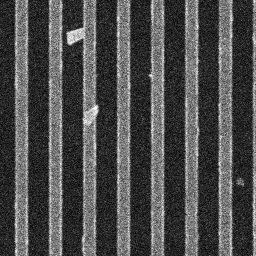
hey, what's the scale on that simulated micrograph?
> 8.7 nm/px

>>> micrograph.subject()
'parallel lines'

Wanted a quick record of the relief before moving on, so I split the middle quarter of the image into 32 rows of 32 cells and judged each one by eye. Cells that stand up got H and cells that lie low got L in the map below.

LLLLLHHHLLLLLHHHLLLLLLHHHLLLLLLH
LLLLLHHHLLLLLLHHLLLLLLHHHLLLLLLH
LLLLLHHHLLLLLHHHLLLLLLHHHLLLLLLH
LLLLLHHHLLLLLLHHLLLLLLHHHLLLLLLH
LLLLLHHHLLLLLLHHLLLLLLHHHLLLLLLH
LLLLLHHHLLLLLLHHLLLLLLHHHLLLLLLH
LLLLLHHHLLLLLLHHLLLLLLHHHLLLLLLH
LLLLLHHHLLLLLLHHLLLLLLHHHLLLLLLH
LLLLLHHHLLLLLLHHLLLLLLHHHLLLLLLH
LLLLLHHHLLLLLLHHLLLLLLHHHLLLLLLH
LLLLLHHHLLLLLLHHLLLLLLHHHLLLLLHH
LLLLLHHHLLLLLLHHLLLLLLHHHLLLLLLH
LLLLLHHHLLLLLLHHLLLLLLHHHLLLLLHH
LLLLLHHHLLLLLLHHLLLLLLHHHLLLLLLH
LLLLLHHHLLLLLLHHLLLLLLHHHLLLLLLH
LLLLLHHHLLLLLLHHLLLLLLHHHLLLLLLH
LLLLLHHHLLLLLLHHLLLLLLHHHLLLLLLH
LLLLLHHHLLLLLLHHLLLLLLHHHLLLLLHH
LLLLLHHHLLLLLLHHLLLLLLHHHLLLLLLH
LLLLLHHHLLLLLLHHLLLLLLHHHLLLLLHH
LLLLLHHHLLLLLLHHLLLLLLHHHLLLLLHH
LLLLLHHHLLLLLLHHLLLLLLHHHLLLLLLH
LLLLLHHHLLLLLLHHLLLLLLHHHLLLLLLH
LLLLLHHHLLLLLLHHLLLLLLHHHLLLLLHH
LLLLLHHHLLLLLHHHLLLLLLHHHLLLLLLH
LLLLLHHHLLLLLLHHLLLLLLHHHLLLLLLH
LLLLLHHHLLLLLLHHLLLLLLHHHLLLLLHH
LLLLLHHHLLLLLLHHLLLLLLHHHLLLLLLH
LLLLLHHHLLLLLHHHLLLLLLHHHLLLLLLH
LLLLLHHHLLLLLHHHLLLLLLHHHLLLLLLH
LLLLLHHHLLLLLLHHLLLLLLHHHLLLLLLH
LLLLLHHHLLLLLLHHLLLLLLHHHLLLLLLH